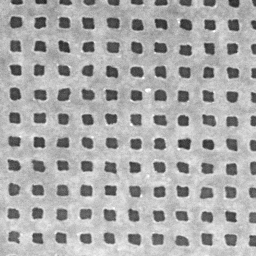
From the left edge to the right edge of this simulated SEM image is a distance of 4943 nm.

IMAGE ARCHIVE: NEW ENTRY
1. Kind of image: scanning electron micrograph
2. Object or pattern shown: a regular array of holes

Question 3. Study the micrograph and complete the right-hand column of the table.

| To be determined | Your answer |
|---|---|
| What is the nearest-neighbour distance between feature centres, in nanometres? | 452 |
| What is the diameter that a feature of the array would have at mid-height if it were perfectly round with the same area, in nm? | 249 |